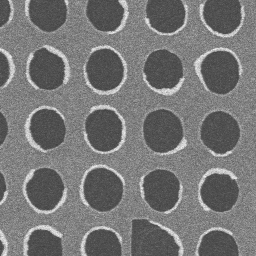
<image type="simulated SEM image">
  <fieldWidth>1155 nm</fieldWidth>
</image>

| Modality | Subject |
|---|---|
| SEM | a regular array of holes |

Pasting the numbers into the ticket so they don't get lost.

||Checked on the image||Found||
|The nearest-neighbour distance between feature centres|260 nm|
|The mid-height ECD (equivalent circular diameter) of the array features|180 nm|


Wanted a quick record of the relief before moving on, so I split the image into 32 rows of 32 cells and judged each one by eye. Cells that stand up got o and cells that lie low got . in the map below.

.ooo....ooo....ooo.....ooo....oo
.ooo....ooo....ooo.....oo.....oo
.ooo....ooo....oooo....ooo....oo
ooooo..ooooo...oooo....ooo....oo
oooooooooooooooooooooooooooooooo
oooooooooooooooooooooooooooooooo
oooo..oooooo..ooooo..oooooo..ooo
.ooo....ooo....ooo.....oo....ooo
.ooo....ooo....ooo.....oo.....oo
.ooo....ooo....ooo.....oo.....oo
oooo....ooo....oooo...oooo....oo
ooooooooooooooooooooooooooo..ooo
oooooooooooooooooooooooooooooooo
oooooooooooooooooooooooooooooooo
.ooo....ooo....ooo....oooo...ooo
.ooo....ooo....ooo.....oo.....oo
.ooo....ooo....ooo.....oo.....oo
.ooo....ooo....ooo.....oo.....oo
ooooo..ooooo..ooooo...oooo...ooo
oooooooooooooooooooooooooooooooo
oooooooooooooooooooooooooooooooo
oooo...oooo...ooooo..ooooooooooo
.ooo....ooo....ooo....oooo...ooo
.oo.....oo.....ooo....ooo.....oo
ooo.....ooo....ooo....ooo.....oo
oooo...oooo....ooo....oooo...ooo
ooooooooooooooooooooooooooo.oooo
ooooooooooooooooo.oooooooooooooo
oooooooooooooooo....oooooooooooo
oooo...oooo....o.....oooo....ooo
ooo.....ooo....o......ooo.....oo
ooo.....ooo....o......ooo.....oo